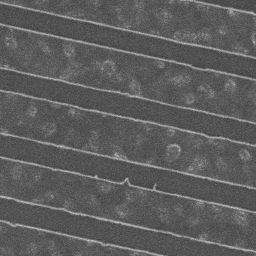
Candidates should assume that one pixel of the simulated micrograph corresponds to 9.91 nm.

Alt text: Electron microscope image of one or a few lines or trenches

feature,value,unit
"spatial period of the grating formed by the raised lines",0.633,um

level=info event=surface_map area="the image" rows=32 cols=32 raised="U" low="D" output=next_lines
UUUUUUUUUUUUUUUUUUUUUUUUUUDDDDDD
DDDDDUUUUUUUUUUUUUUUUUUUUUUUUUUD
DDDDDDDDDDUUUUUUUUUUUUUUUUUUUUUU
UUDDDDDDDDDDDDUUUUUUUUUUUUUUUUUU
UUUUUUUDDDDDDDDDDDDUUUUUUUUUUUUU
UUUUUUUUUUUUDDDDDDDDDDDUUUUUUUUU
UUUUUUUUUUUUUUUUDDDDDDDDDDDDUUUU
UUUUUUUUUUUUUUUUUUUUUDDDDDDDDDDD
UUUUUUUUUUUUUUUUUUUUUUUUUDDDDDDD
DDDDDUUUUUUUUUUUUUUUUUUUUUUUUUDD
DDDDDDDDDUUUUUUUUUUUUUUUUUUUUUUU
UDDDDDDDDDDDDDDUUUUUUUUUUUUUUUUU
UUUUUUDDDDDDDDDDDDDUUUUUUUUUUUUU
UUUUUUUUUUDDDDDDDDDDDDDUUUUUUUUU
UUUUUUUUUUUUUUUDDDDDDDDDDDDDUUUU
UUUUUUUUUUUUUUUUUUUUDDDDDDDDDDDD
UUUUUUUUUUUUUUUUUUUUUUUUDDDDDDDD
DDDDUUUUUUUUUUUUUUUUUUUUUUUUUDDD
DDDDDDDDUUUUUUUUUUUUUUUUUUUUUUUU
DDDDDDDDDDDDDUUUUUUUUUUUUUUUUUUU
UUUUDDDDDDDDDDDDDUUUUUUUUUUUUUUU
UUUUUUUUUDDDDDDDDDDDDDUUUUUUUUUU
UUUUUUUUUUUUUDDDDDDDDDDDDDDUUUUU
UUUUUUUUUUUUUUUUUUDDDDDDDDDDDDDU
UUUUUUUUUUUUUUUUUUUUUUUDDDDDDDDD
DDDDUUUUUUUUUUUUUUUUUUUUUUUDDDDD
DDDDDDDDDUUUUUUUUUUUUUUUUUUUUUUU
DDDDDDDDDDDDDUUUUUUUUUUUUUUUUUUU
UUUUDDDDDDDDDDDDDDUUUUUUUUUUUUUU
UUUUUUUUUDDDDDDDDDDDDDUUUUUUUUUU
UUUUUUUUUUUUUDDDDDDDDDDDDDDUUUUU
UUUUUUUUUUUUUUUUUUDDDDDDDDDDDDDD